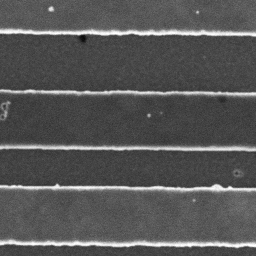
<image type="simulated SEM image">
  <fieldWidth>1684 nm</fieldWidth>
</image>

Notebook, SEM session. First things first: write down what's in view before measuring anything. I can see lines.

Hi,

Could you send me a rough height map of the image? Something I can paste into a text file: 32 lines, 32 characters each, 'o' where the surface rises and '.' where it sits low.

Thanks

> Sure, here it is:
oooooooooooooooooooooooooooooooo
oooooooooooooooooooooooooooooooo
oooooooooooooooooooooooooooooooo
oooooooooooooooooooooooooooooooo
................................
................................
................................
................................
................................
................................
................................
oooooooooo....ooo...............
oooooooooooooooooooooooooooooooo
oooooooooooooooooooooooooooooooo
oooooooooooooooooooooooooooooooo
oooooooooooooooooooooooooooooooo
oooooooooooooooooooooooooooooooo
oooooooooooooooooooooooooooooooo
...........oo.oooooooooooooooooo
................................
................................
................................
................................
ooooooooooooooooooooo...oooo....
oooooooooooooooooooooooooooooooo
oooooooooooooooooooooooooooooooo
oooooooooooooooooooooooooooooooo
oooooooooooooooooooooooooooooooo
oooooooooooooooooooooooooooooooo
oooooooooooooooooooooooooooooooo
..o.oooooooooooooooooooooooooooo
................................